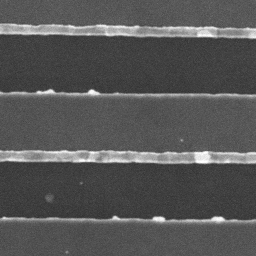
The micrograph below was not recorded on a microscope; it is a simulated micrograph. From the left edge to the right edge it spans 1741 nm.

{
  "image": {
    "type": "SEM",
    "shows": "lines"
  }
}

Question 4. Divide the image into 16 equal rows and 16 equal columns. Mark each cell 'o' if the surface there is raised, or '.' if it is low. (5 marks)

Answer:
oooooooooooooooo
oooooooooooooooo
................
................
................
................
oooooooooooooooo
oooooooooooooooo
oooooooooooooooo
oooooooooooooooo
................
................
................
................
oooooooooooooooo
oooooooooooooooo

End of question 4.